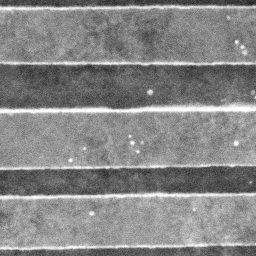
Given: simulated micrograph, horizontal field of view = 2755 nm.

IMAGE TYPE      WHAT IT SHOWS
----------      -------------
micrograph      lines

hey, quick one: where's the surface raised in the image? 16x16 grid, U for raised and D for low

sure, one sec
DDDDDDDUUUUUUUUU
UUUUUUUUUUUUUUUU
UUUUUUUUUUUUUUUU
UUUUUUUUUUUUUUUU
DDDDDDDDDDDDDDDD
DDDDDDDDDDDDDDDD
DDDDDDDDDDDDDDDD
UUUUUUUUUUUUUUUU
UUUUUUUUUUUUUUUU
UUUUUUUUUUUUUUUU
UUDDDDDDDDDDDDDD
DDDDDDDDDDDDDDDD
UUUUUUUUUUUUUUUU
UUUUUUUUUUUUUUUU
UUUUUUUUUUUUUUUU
UUUDDDDDDDDDDDDD